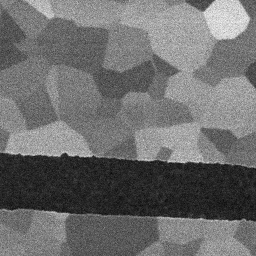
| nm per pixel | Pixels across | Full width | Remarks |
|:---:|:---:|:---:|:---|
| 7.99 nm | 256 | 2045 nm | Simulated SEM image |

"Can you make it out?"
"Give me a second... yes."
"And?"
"one or a few lines or trenches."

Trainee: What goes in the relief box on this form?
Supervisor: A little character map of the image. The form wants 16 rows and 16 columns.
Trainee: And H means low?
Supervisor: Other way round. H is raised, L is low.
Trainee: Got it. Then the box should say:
HHHHHHHHHHHHHHHH
HHHHHHHHHHHHHHHH
HHHHHHHHHHHHHHHH
HHHHHHHHHHHHHHHH
HHHHHHHHHHHHHHHH
HHHHHHHHHHHHHHHH
HHHHHHHHHHHHHHHH
HHHHHHHHHHHHHHHH
HHHHHHHHHHHHHHHH
HHHHHHHHHHHHHHHH
LLLLLLLLLLLLLLLH
LLLLLLLLLLLLLLLL
LLLLLLLLLLLLLLLL
HHHHHHHHHLLLLLLL
HHHHHHHHHHHHHHHH
HHHHHHHHHHHHHHHH